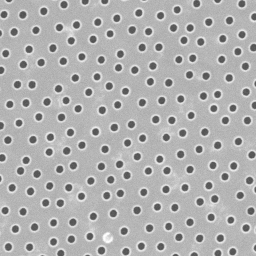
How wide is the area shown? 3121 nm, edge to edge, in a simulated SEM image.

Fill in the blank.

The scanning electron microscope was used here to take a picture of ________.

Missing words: a regular array of holes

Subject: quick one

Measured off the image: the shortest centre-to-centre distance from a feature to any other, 207 nanometers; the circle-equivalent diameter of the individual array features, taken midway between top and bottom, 8.41 px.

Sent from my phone